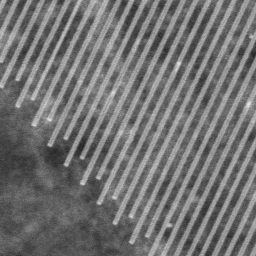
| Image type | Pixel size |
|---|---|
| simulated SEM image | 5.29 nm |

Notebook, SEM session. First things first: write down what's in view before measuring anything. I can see parallel lines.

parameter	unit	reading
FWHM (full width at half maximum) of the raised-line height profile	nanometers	19.7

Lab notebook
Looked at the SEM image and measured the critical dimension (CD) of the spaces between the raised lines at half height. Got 39.4 nm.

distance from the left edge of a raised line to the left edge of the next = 61 nanometers